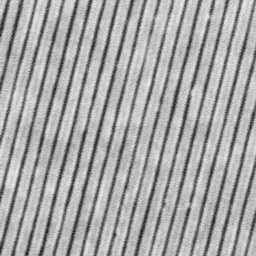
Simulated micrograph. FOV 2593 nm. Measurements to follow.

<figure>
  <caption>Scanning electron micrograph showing parallel lines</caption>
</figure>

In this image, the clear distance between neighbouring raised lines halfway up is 0.043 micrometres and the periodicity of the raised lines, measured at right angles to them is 135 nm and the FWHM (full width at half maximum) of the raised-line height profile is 85.9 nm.